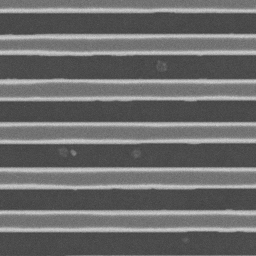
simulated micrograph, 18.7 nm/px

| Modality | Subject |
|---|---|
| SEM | lines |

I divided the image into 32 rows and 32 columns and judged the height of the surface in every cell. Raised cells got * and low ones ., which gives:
********************************
................................
................................
................................
.....**.**..********************
********************************
********************************
................................
................................
................................
********************************
********************************
................................
................................
................................
********************************
********************************
********************************
................................
................................
................................
********************************
********************************
........**......................
................................
................................
********************************
********************************
********************************
................................
................................
................................